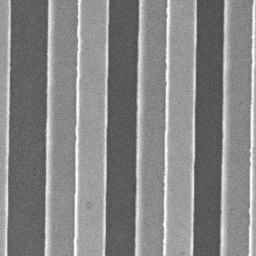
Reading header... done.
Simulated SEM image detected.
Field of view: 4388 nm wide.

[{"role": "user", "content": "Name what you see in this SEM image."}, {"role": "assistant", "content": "lines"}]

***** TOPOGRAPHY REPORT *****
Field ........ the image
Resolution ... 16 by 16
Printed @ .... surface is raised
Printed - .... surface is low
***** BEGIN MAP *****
@--@@@@--@@@--@@
@--@@@@--@@@--@@
@--@@@@--@@@--@@
@--@@@@--@@@--@@
@--@@@@--@@@--@@
@--@@@@--@@@--@@
@--@@@@--@@@--@@
@--@@@@--@@@--@@
@--@@@@--@@@--@@
@--@@@@--@@@--@@
---@@@@--@@@--@@
---@@@@--@@@--@@
---@@@@--@@@--@@
---@@@@--@@@--@@
---@@@@--@@@--@@
---@@@@--@@@--@@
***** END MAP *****